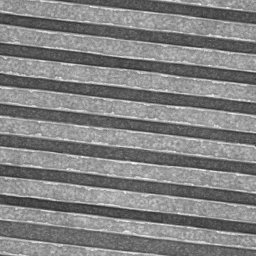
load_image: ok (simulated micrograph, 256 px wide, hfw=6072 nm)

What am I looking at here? parallel lines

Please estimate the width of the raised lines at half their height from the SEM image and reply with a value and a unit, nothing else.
0.401 um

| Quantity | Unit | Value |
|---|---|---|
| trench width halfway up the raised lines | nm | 298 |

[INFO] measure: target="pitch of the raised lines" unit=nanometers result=702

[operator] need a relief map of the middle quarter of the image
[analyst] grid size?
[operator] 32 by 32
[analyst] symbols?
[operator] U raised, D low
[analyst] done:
UUUUUUUDDDDDDDDDDDDDDDDDDDDDDDDD
UUUUUUUUUUUUUUUUDDDDDDDDDDDDDDDD
UUUUUUUUUUUUUUUUUUUUUUUUDDDDDDDD
UUUUUUUUUUUUUUUUUUUUUUUUUUUUUUUD
DDDUUUUUUUUUUUUUUUUUUUUUUUUUUUUU
DDDDDDDDDDDDDUUUUUUUUUUUUUUUUUUU
DDDDDDDDDDDDDDDDDDDDDDUUUUUUUUUU
UUDDDDDDDDDDDDDDDDDDDDDDDDDDDDUU
UUUUUUUUUDDDDDDDDDDDDDDDDDDDDDDD
UUUUUUUUUUUUUUUUUDDDDDDDDDDDDDDD
UUUUUUUUUUUUUUUUUUUUUUUUUUUUDDDD
UUUUUUUUUUUUUUUUUUUUUUUUUUUUUUUU
DDDDDDDDUUUUUUUUUUUUUUUUUUUUUUUU
DDDDDDDDDDDDDDDDDUUUUUUUUUUUUUUU
DDDDDDDDDDDDDDDDDDDDDDDDDUUUUUUU
UUUUDDDDDDDDDDDDDDDDDDDDDDDDDDDD
UUUUUUUUUUUUUUDDDDDDDDDDDDDDDDDD
UUUUUUUUUUUUUUUUUUUUUUUDDDDDDDDD
UUUUUUUUUUUUUUUUUUUUUUUUUUUUUUUD
DDDUUUUUUUUUUUUUUUUUUUUUUUUUUUUU
DDDDDDDDDDDDDUUUUUUUUUUUUUUUUUUU
DDDDDDDDDDDDDDDDDDDDDDUUUUUUUUUU
DDDDDDDDDDDDDDDDDDDDDDDDDDDDDUUU
UUUUUUUDDDDDDDDDDDDDDDDDDDDDDDDD
UUUUUUUUUUUUUUUUUDDDDDDDDDDDDDDD
UUUUUUUUUUUUUUUUUUUUUUUUUUDDDDDD
UUUUUUUUUUUUUUUUUUUUUUUUUUUUUUUU
DDDDDDDDUUUUUUUUUUUUUUUUUUUUUUUU
DDDDDDDDDDDDDDDDDUUUUUUUUUUUUUUU
DDDDDDDDDDDDDDDDDDDDDDDDDUUUUUUU
UUUUDDDDDDDDDDDDDDDDDDDDDDDDDDDD
UUUUUUUUUUUUDDDDDDDDDDDDDDDDDDDD